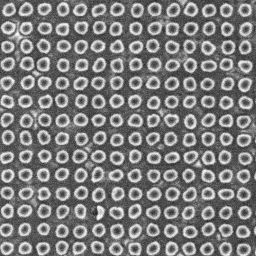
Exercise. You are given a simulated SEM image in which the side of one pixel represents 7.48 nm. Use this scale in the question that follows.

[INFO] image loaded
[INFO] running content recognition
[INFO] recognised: a regular array of raised bodies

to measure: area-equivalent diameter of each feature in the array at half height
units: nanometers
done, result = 96.2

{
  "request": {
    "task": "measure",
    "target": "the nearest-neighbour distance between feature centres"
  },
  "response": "131 nm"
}